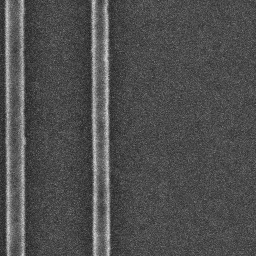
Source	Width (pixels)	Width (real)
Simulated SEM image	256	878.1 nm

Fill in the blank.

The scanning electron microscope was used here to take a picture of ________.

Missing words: one or a few lines or trenches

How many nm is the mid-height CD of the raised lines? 51.7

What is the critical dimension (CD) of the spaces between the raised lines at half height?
242 nm